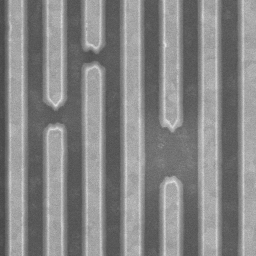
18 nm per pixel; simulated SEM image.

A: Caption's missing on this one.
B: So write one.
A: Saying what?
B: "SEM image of parallel lines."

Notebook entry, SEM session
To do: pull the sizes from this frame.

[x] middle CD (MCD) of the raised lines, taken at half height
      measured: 319 nanometres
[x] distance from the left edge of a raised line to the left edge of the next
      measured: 696 nm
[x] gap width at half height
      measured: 371 nanometres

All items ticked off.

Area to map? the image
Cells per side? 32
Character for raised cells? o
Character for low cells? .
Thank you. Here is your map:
.oo...oo..ooo..ooo..oo...oo...oo
.oo...oo..ooo..ooo..oo...oo...oo
.oo...oo..ooo..ooo..oo...oo...oo
.oo...oo..ooo..ooo..oo...oo...oo
.oo...oo...oo..ooo..oo...oo...oo
.oo...oo...oo..ooo..oo...oo...oo
.oo...oo.......ooo..oo...oo...oo
.oo...oo.......ooo..oo...oo...oo
.oo...oo...o...ooo..oo...oo...oo
.oo...oo...oo..ooo..oo...oo...oo
.oo...oo...oo..ooo..oo...oo...oo
.oo...oo...oo..ooo..oo...oo...oo
.oo...oo...oo..ooo..oo...oo...oo
.oo........oo..ooo..oo...oo...oo
.oo........oo..ooo..oo...oo...oo
.oo........oo..ooo...o...oo...oo
.oo...oo...oo..ooo.......oo...oo
.oo...oo...oo..ooo.......oo...oo
.oo...oo...oo..ooo.......oo...oo
.oo...oo...oo..ooo.......oo...oo
.oo...oo...oo..ooo.......oo...oo
.oo...oo...oo..ooo.......oo...oo
.oo...oo...oo..ooo...o...oo...oo
.oo...oo...oo..ooo..oo...oo...oo
.oo...oo...oo..ooo..oo...oo...oo
.oo...oo...oo..ooo..oo...oo...oo
.oo...oo...oo..ooo..oo...oo...oo
.oo...oo...oo..ooo..oo...oo...oo
.oo...oo...oo..ooo..oo...oo...oo
.oo...oo...oo..ooo..oo...oo...oo
.oo...oo...oo..ooo..oo...oo...oo
.oo...oo...oo..ooo..oo...oo...oo